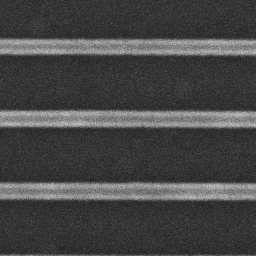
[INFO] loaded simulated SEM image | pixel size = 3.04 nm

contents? one or a few lines or trenches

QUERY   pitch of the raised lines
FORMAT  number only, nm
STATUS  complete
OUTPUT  220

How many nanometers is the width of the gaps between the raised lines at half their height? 183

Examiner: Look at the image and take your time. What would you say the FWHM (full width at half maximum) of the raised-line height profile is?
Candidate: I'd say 36.8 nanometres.